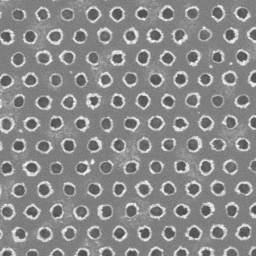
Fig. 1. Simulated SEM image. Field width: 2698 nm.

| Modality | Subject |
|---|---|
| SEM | a regular array of holes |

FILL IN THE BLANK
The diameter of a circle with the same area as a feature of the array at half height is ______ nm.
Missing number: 116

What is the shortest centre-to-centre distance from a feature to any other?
257 nm